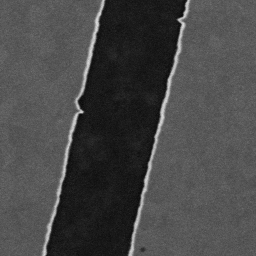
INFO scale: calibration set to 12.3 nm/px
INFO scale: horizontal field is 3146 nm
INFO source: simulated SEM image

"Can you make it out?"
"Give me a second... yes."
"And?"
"one or a few lines or trenches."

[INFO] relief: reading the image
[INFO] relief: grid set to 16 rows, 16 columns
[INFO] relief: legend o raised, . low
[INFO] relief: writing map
oooooo......oooo
oooooo.....ooooo
oooooo.....ooooo
oooooo.....ooooo
ooooo......ooooo
ooooo......ooooo
ooooo.....oooooo
ooooo.....oooooo
oooo......oooooo
oooo......oooooo
oooo.....ooooooo
oooo.....ooooooo
oooo.....ooooooo
ooo......ooooooo
ooo.....oooooooo
ooo.....oooooooo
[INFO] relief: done